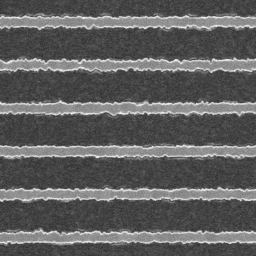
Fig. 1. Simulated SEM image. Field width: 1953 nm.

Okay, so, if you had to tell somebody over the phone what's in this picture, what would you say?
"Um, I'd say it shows parallel lines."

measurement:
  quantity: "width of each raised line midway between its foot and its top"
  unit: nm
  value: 74.4